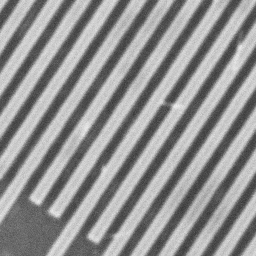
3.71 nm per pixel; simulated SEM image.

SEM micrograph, groups of lines, slits or small figures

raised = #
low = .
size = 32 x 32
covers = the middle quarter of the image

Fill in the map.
###...####...####...####...####.
##...####...####...####...####..
#....###....###....###....###...
#...####...####...####...####...
....###....###...####...####...#
...###....###....###....###....#
..####...####...####...####...##
..###...####....###...####...###
.###....###....###....###....###
####...####...####...####...####
###....###....###....###...####.
##....###....###....###....###..
##...####...####...####...####..
#....###....###...####...####...
#...####...###....###....###....
...####...####...####...###....#
..####....###...####...####...##
..###....###....###....###....##
.####...####...####...####...###
.###....###....###....###...####
####...###....###....###....###.
###...####...####...####...####.
##....###....###....###...####..
#....###....###....###....###...
#...####...####...####...####...
....###....###....###...####...#
...####...####...###....###....#
..####...####...####...####...##
..###....###....###...####...###
.####...####...###....###....###
####...####...####...####...####
###....###....###....###...####.